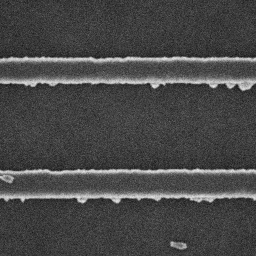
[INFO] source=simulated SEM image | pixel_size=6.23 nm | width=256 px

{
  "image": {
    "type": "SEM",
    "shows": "lines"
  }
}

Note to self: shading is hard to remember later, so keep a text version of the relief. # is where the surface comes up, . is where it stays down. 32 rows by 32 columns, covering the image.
................................
................................
................................
................................
................................
................................
................................
################################
################################
################################
..............................#.
................................
................................
................................
................................
................................
................................
................................
................................
................................
................................
################################
################################
################################
################################
................................
................................
................................
................................
................................
................................
................................